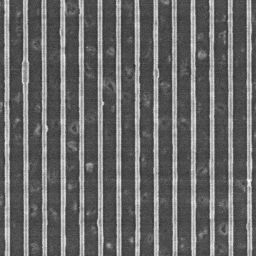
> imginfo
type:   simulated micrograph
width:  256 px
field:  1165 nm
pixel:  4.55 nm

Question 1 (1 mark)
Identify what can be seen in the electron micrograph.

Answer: parallel lines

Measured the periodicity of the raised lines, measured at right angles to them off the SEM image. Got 84.8 nm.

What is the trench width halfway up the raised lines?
0.0699 micrometres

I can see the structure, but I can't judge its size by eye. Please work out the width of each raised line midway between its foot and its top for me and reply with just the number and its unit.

0.0176 um